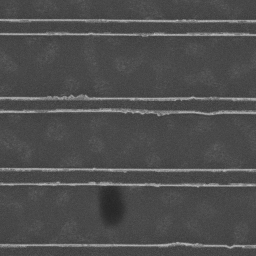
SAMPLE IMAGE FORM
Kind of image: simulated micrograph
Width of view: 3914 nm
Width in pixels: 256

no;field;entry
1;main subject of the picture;one or a few lines or trenches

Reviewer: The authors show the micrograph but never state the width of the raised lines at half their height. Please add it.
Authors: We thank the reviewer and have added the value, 224 nm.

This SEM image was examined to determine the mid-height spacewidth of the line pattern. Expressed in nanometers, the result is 929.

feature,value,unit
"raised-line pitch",1140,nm